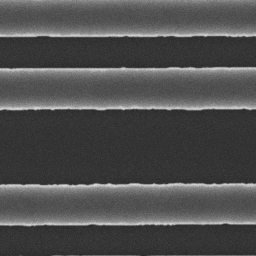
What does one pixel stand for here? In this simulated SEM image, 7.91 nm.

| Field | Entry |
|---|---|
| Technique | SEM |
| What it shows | lines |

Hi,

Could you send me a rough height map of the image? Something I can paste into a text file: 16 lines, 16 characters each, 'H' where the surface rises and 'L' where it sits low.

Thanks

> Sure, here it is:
HHHHHHHHHHHHHHHH
HHHHHHHHHHHHHHHH
LLLLLLLLLLLLLLLL
LLLLLLLLLLLLLLLL
HHHHHHHHHHHHHHHH
HHHHHHHHHHHHHHHH
HHHHHHHHHHHHHHHH
LLLLLLLLLLLLLLLL
LLLLLLLLLLLLLLLL
LLLLLLLLLLLLLLLL
LLLLLLLLLLLLLLLL
LLLLLLHLHLHHHHHH
HHHHHHHHHHHHHHHH
HHHHHHHHHHHHHHHH
LLLLLLLLLLLLLLLL
LLLLLLLLLLLLLLLL